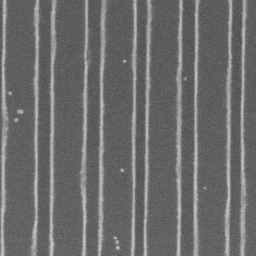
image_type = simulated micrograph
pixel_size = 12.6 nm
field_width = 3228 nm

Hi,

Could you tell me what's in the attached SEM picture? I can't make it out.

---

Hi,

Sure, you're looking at lines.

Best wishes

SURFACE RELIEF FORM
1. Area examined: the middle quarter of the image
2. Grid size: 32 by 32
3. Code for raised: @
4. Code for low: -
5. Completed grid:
@@@@@----@@@@@@@@----@@@@@@@@---
@@@@@----@@@@@@@@----@@@@@@@@---
@@@@@----@@@@@@@@----@@@@@@@@---
@@@@@----@@@@@@@@----@@@@@@@@---
@@@@@----@@@@@@@@----@@@@@@@@---
@@@@@----@@@@@@@@----@@@@@@@@---
@@@@@----@@@@@@@@----@@@@@@@@---
@@@@@----@@@@@@@@----@@@@@@@@---
@@@@@----@@@@@@@@----@@@@@@@@---
@@@@@----@@@@@@@@----@@@@@@@@---
@@@@@----@@@@@@@@----@@@@@@@@---
@@@@@----@@@@@@@@----@@@@@@@@---
@@@@@----@@@@@@@@----@@@@@@@@---
@@@@@----@@@@@@@@----@@@@@@@@---
@@@@@----@@@@@@@@----@@@@@@@@---
@@@@@----@@@@@@@@----@@@@@@@@---
@@@@@----@@@@@@@@----@@@@@@@@---
@@@@@----@@@@@@@@----@@@@@@@@---
@@@@@----@@@@@@@@----@@@@@@@@---
@@@@@----@@@@@@@@----@@@@@@@@---
@@@@@----@@@@@@@@----@@@@@@@@---
@@@@@----@@@@@@@@----@@@@@@@@---
@@@@@----@@@@@@@@----@@@@@@@@---
@@@@@----@@@@@@@@----@@@@@@@@---
@@@@@----@@@@@@@@----@@@@@@@@---
@@@@@----@@@@@@@@----@@@@@@@@---
@@@@@----@@@@@@@@----@@@@@@@@---
@@@@@----@@@@@@@@----@@@@@@@@---
@@@@@----@@@@@@@@----@@@@@@@@---
@@@@@----@@@@@@@@----@@@@@@@@---
@@@@@----@@@@@@@@----@@@@@@@@---
@@@@@----@@@@@@@@----@@@@@@@@---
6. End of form